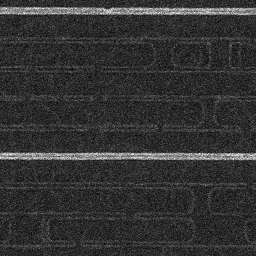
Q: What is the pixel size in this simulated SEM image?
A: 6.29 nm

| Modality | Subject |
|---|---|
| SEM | parallel lines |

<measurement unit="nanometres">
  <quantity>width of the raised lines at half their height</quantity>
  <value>34.6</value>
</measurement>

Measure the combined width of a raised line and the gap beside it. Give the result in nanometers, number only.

183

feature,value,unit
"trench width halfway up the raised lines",151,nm